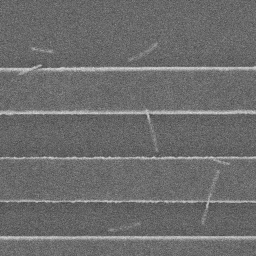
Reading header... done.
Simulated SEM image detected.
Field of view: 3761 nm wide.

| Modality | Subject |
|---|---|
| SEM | lines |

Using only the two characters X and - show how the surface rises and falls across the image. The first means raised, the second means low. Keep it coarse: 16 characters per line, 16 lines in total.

----------------
----------------
----------------
----------------
XXXXXXXXXXXXXXXX
XXXXXXXXXXXXXXXX
XXXXXXXXXXXXXXXX
----------------
----------------
----------------
XXXXXXXXXXXXXXXX
XXXXXXXXXXXXXXXX
XXXXXXXXXXXXXXXX
----------------
----------------
XXXXXXXXXXXXXXXX